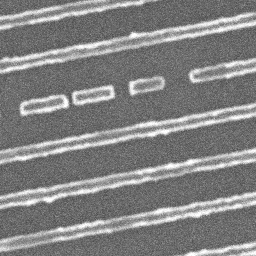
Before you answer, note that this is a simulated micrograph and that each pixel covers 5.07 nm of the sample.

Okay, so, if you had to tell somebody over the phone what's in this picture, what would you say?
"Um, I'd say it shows parallel lines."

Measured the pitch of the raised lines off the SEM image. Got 44.1 pixels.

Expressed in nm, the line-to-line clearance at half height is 164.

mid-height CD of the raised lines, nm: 59.8